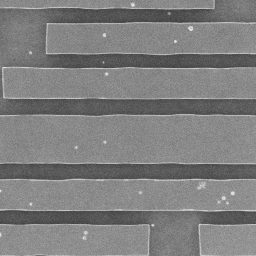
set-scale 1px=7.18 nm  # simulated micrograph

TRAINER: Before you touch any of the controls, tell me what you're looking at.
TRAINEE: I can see groups of lines, slits or small figures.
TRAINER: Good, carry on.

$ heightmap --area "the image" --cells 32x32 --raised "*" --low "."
***************************.....
................................
................................
......**************************
......**************************
......**************************
......**************************
................................
.***...........**...............
********************************
********************************
********************************
................................
................................
.*********...******************.
********************************
********************************
********************************
********************************
********************************
................................
................................
*******.************************
********************************
********************************
********************************
................................
................................
*******************......*******
*******************......*******
*******************......*******
*******************......*******